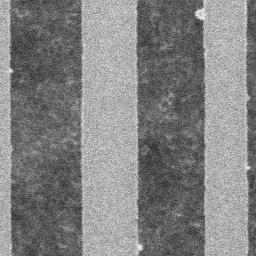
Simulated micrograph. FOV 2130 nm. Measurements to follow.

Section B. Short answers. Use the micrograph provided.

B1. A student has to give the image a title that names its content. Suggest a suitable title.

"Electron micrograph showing one or a few lines or trenches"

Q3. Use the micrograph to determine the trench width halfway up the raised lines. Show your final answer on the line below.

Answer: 0.583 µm